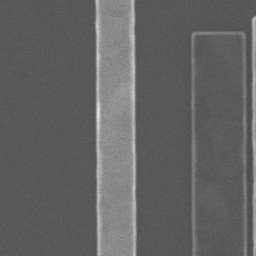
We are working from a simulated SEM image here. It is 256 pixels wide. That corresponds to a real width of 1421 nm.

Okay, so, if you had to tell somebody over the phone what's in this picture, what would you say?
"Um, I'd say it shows wiring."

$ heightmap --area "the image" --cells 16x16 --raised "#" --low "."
......##........
......##........
......##....####
......##....####
......##....####
......##....####
......##....####
.......#....####
......##....####
......##....####
......##....####
......##....####
......##....####
......##....####
......##....####
......##....####